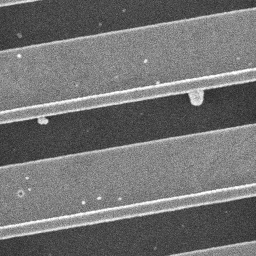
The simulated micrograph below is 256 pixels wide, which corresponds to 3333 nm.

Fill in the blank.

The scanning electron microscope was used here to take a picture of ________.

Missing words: lines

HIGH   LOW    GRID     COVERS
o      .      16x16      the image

................
..........oooooo
....oooooooooooo
oooooooooooooooo
oooooooooooooooo
ooooooooooooo...
oooooooo........
ooo.............
............oooo
......oooooooooo
oooooooooooooooo
oooooooooooooooo
ooooooooooooooo.
ooooooooo.......
ooo.............
.............ooo